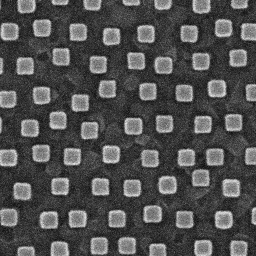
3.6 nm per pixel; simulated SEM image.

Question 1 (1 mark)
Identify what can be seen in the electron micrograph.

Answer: a regular array of raised bodies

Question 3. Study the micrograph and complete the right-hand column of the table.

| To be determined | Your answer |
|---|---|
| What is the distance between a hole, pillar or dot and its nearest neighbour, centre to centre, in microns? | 0.111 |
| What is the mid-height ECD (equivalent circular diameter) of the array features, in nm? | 64.3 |